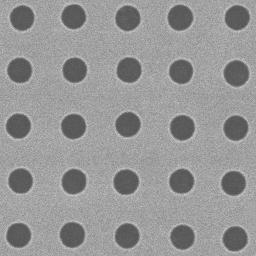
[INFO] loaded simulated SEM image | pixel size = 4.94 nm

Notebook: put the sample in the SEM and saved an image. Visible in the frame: a regular array of holes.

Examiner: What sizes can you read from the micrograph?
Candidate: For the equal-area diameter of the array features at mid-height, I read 121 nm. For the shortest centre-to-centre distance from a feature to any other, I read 261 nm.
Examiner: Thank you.